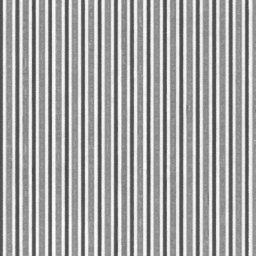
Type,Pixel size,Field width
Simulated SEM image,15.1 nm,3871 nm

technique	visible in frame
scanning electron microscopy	parallel lines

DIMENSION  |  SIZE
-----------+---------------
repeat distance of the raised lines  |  124 nm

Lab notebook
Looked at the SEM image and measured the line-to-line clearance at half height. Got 85.1 nanometres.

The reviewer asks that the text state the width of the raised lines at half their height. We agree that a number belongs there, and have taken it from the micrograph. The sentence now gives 41.6 nanometers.